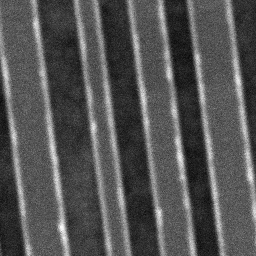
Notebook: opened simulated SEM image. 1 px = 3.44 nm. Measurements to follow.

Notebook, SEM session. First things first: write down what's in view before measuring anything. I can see one or a few lines or trenches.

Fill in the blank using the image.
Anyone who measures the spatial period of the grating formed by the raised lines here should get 219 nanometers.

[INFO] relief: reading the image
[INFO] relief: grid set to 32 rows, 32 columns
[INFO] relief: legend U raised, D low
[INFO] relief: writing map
UUUUDDDDDUUUDDDDUUUUDDDUUUUUUDDD
UUUUUDDDDDUUDDDDUUUUUDDDUUUUUDDD
UUUUUDDDDDUUDDDDUUUUUDDDUUUUUDDD
UUUUUDDDDDUUUDDDUUUUUDDDUUUUUDDD
UUUUUDDDDDUUUDDDDUUUUDDDUUUUUDDD
UUUUUDDDDDUUUDDDDUUUUDDDUUUUUDDD
UUUUUDDDDDUUUDDDDUUUUDDDUUUUUUDD
UUUUUDDDDDUUUDDDDUUUUDDDUUUUUUDD
UUUUUDDDDDUUUDDDDUUUUDDDDUUUUUDD
UUUUUUDDDDDUUDDDDUUUUUDDDUUUUUDD
DUUUUUDDDDDUUDDDDUUUUUDDDUUUUUDD
DUUUUUDDDDDUUUDDDDUUUUDDDUUUUUDD
DUUUUUDDDDDUUUDDDDUUUUDDDUUUUUDD
DUUUUUDDDDDUUUDDDDUUUUDDDUUUUUDD
DUUUUUDDDDDUUUDDDDUUUUDDDUUUUUUD
DUUUUUDDDDDUUUDDDDUUUUDDDUUUUUUD
DUUUUUUDDDDDUUDDDDUUUUDDDDUUUUUD
DDUUUUUDDDDDUUDDDDUUUUUDDDUUUUUD
DDUUUUUDDDDDUUUDDDUUUUUDDDUUUUUD
DDUUUUUDDDDDUUUDDDDUUUUDDDUUUUUD
DDUUUUUDDDDDUUUDDDDUUUUDDDUUUUUD
DDUUUUUDDDDDUUUDDDDUUUUDDDUUUUUD
DDUUUUUDDDDDUUUDDDDUUUUDDDUUUUUU
DDUUUUUDDDDDUUUDDDDUUUUDDDDUUUUU
DDUUUUUUDDDDDUUDDDDUUUUUDDDUUUUU
DDUUUUUUDDDDDUUDDDDUUUUUDDDUUUUU
DDDUUUUUDDDDDUUUDDDDUUUUDDDUUUUU
DDDUUUUUDDDDDUUUDDDDUUUUDDDUUUUU
DDDUUUUUDDDDDUUUDDDDUUUUDDDUUUUU
DDDUUUUUDDDDDUUUDDDDUUUUDDDUUUUU
DDDUUUUUDDDDDUUUDDDDUUUUDDDUUUUU
DDDUUUUUDDDDDDUUDDDDUUUUDDDDUUUU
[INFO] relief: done